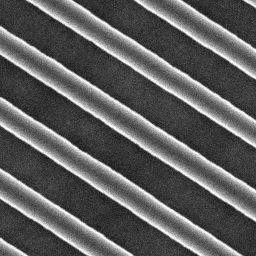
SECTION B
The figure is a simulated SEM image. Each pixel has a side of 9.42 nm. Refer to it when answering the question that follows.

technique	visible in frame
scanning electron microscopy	lines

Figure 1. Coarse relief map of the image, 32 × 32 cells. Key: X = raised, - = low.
----XXXXXX--------XXXXX--------X
------XXXXX--------XXXXXX-------
-------XXXXXX--------XXXXX------
---------XXXXX--------XXXXXX----
XX--------XXXXXX--------XXXXX---
XXX---------XXXXX--------XXXXXX-
XXXXX--------XXXXXX--------XXXXX
-XXXXXX--------XXXXX--------XXXX
---XXXXX---------XXXXX--------XX
----XXXXXX--------XXXXXX-------X
------XXXXX---------XXXXX-------
-------XXXXXX--------XXXXX------
X--------XXXXX---------XXXXX----
XX--------XXXXXX--------XXXXXX--
XXX---------XXXXXX--------XXXXX-
XXXXX--------XXXXXX---------XXXX
-XXXXXX--------XXXXXX--------XXX
---XXXXX--------XXXXXX---------X
----XXXXXX--------XXXXXX--------
------XXXXX--------XXXXXX-------
-------XXXXXX--------XXXXXX-----
X--------XXXXX---------XXXXX----
XX---------XXXXX--------XXXXXX--
XXXX--------XXXXX---------XXXXX-
XXXXX--------XXXXXX--------XXXXX
-XXXXXX--------XXXXX---------XXX
---XXXXX---------XXXXX--------XX
----XXXXXX--------XXXXX---------
------XXXXX---------XXXXX-------
-------XXXXXX--------XXXXXX-----
X--------XXXXX---------XXXXX----
XXX-------XXXXXX--------XXXXXX--